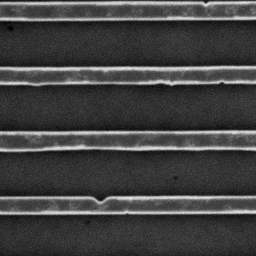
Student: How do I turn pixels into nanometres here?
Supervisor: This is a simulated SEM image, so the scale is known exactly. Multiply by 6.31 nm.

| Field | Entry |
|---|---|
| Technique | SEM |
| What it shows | one or a few lines or trenches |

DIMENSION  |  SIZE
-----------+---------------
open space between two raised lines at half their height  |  301 nm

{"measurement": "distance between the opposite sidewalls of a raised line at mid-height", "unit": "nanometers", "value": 105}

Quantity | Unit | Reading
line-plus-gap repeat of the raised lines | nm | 409